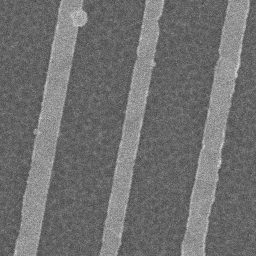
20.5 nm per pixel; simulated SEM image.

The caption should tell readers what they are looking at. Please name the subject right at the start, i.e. one or a few lines or trenches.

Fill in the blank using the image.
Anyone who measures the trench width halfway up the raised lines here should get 1310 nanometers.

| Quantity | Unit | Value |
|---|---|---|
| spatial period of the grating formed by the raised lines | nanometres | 1680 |